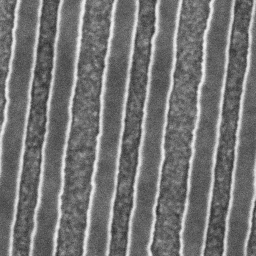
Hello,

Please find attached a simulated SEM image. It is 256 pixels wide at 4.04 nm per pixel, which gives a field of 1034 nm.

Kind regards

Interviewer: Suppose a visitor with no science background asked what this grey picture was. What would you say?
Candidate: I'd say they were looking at lines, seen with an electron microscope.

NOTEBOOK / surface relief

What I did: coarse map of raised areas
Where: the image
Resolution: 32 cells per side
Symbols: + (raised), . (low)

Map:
..+++..++++...+++...+++...+++...
..+++..+++....+++...++....+++...
..+++..+++....+++...++....+++..+
..+++..+++....+++..+++....+++..+
..+++..+++....+++..+++....+++..+
..+++..+++....+++..+++...++++..+
..++...+++...++++..+++...+++...+
.+++...+++...+++...+++...+++...+
.+++...+++...+++...+++...+++...+
.+++...+++...+++...+++...+++...+
.+++..+++....+++...+++...+++..++
.+++..+++....+++..+++....+++..++
.+++..+++....+++..+++....+++..++
.+++..+++....+++..+++....+++..++
.+++..+++....+++..+++....+++..++
+++...+++....++...+++...+++...++
+++...+++...+++...+++...+++...++
+++...++....+++...++....+++...++
+++..+++....+++..+++....+++..+++
+++..+++....+++..+++....+++..+++
+++..+++....+++..+++....+++..+++
+++..+++....+++..+++....+++..+++
++...+++....+++..+++....+++..+++
++...+++....++...+++....+++..+++
++...+++...+++...+++...+++...+++
++...+++...+++...+++...+++...+++
++..++++...+++..+++....+++...+++
++..+++....+++..+++....+++..+++.
++..+++....+++..+++....+++..+++.
++..+++....+++..+++....+++..+++.
+...+++....+++..+++....+++..+++.
+...+++...++++..+++....++...+++.